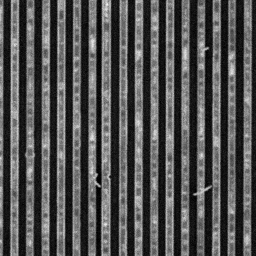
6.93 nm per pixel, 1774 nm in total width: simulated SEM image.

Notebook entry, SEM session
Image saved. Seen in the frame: parallel lines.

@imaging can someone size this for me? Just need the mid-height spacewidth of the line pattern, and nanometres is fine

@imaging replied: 61.5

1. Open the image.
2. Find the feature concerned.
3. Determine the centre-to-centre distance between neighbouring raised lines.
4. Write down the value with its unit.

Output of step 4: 0.108 micrometres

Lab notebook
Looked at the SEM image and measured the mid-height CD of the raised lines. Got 0.0477 um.